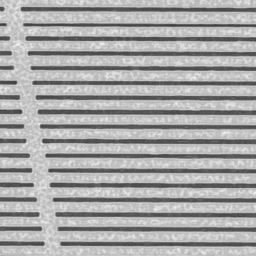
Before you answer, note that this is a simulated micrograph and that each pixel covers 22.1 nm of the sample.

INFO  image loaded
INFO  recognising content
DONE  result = parallel lines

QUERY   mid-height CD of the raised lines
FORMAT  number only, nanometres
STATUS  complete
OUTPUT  215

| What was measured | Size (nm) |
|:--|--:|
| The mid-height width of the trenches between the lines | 99.4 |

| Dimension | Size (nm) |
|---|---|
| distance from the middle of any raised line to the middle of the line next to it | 322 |